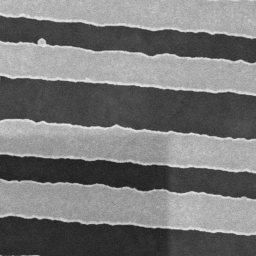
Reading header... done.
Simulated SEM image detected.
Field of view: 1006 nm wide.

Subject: lines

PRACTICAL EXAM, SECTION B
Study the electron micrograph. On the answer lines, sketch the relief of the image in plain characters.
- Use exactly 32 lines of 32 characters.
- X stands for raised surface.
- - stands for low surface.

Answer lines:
XXXXXXXXXXXXXXXXXXXXXXXXXXXXXXXX
XXXXXXXXXXXXXXXXXXXXXXXXXXXXXXXX
------XXXXXXXXXXXXXXXXXXXXXXXXXX
------------------XXXXXXXXXXXXXX
------------------------------XX
XXXXXX--------------------------
XXXXXXXXXXXXXXXX----------------
XXXXXXXXXXXXXXXXXXXXXXXXXXXX----
XXXXXXXXXXXXXXXXXXXXXXXXXXXXXXXX
-XXXXXXXXXXXXXXXXXXXXXXXXXXXXXXX
---------------XXXXXXXXXXXXXXXXX
-----------------------------XXX
--------------------------------
--------------------------------
--------------------------------
XXXXXXX-------------------------
XXXXXXXXXXXXXXXXXXXX-X----------
XXXXXXXXXXXXXXXXXXXXXXXXXXXXXXXX
XXXXXXXXXXXXXXXXXXXXXXXXXXXXXXXX
-----XXXXXXXXXXXXXXXXXXXXXXXXXXX
------------------XXXXXXXXXXXXXX
--------------------------------
--------------------------------
XXXXXXXXXXXXXX-X----------------
XXXXXXXXXXXXXXXXXXXXXXXXXXXX----
XXXXXXXXXXXXXXXXXXXXXXXXXXXXXXXX
XXXXXXXXXXXXXXXXXXXXXXXXXXXXXXXX
--------XXXXXXXXXXXXXXXXXXXXXXXX
----------------------XXXXXXXXXX
--------------------------------
--------------------------------
--------------------------------